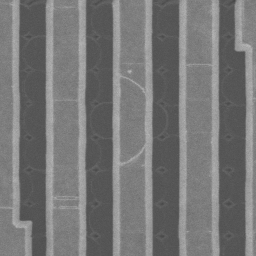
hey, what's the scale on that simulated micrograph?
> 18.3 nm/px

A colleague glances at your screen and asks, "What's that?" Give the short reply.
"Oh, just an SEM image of wiring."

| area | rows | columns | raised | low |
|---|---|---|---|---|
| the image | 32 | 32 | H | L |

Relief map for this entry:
HHLLLLHHHHLLLLLHHHHLLLLHHHHLLLHH
HHLLLLHHHHLLLLLHHHHLLLLHHHHLLLHH
HHLLLLHHHHLLLLLHHHHLLLLHHHHLLLHH
HHLLLLHHHHLLLLLHHHHLLLLHHHHLLLHH
HHLLLLHHHHLLLLLHHHHLLLLHHHHLLLHH
HHLLLLHHHHLLLLLHHHHLLLLHHHHLLLHH
HHLLLLHHHHLLLLLHHHHLLLLHHHHLLLLH
HHLLLLHHHHLLLLLHHHHLLLLHHHHLLLLH
HHLLLLHHHHLLLLLHHHHLLLLHHHHLLLLH
HHLLLLHHHHLLLLLHHHHLLLLHHHHLLLLH
HHLLLLHHHHLLLLLHHHHLLLLHHHHLLLLH
HHLLLLHHHHLLLLLHHHHLLLLHHHHLLLLH
HHLLLLHHHHLLLLLHHHHLLLLHHHHLLLLH
HHLLLLHHHHLLLLLHHHHLLLLHHHHLLLLH
HHLLLLHHHHLLLLLHHHHLLLLHHHHLLLLH
HHLLLLHHHHLLLLLHHHHLLLLHHHHLLLLH
HHLLLLHHHHLLLLLHHHHLLLLHHHHLLLLH
HHLLLLHHHHLLLLLHHHHLLLLHHHHLLLLH
HHLLLLHHHHLLLLLHHHHLLLLHHHHLLLLH
HHLLLLHHHHLLLLLHHHHLLLLHHHHLLLLH
HHLLLLHHHHLLLLLHHHHLLLLHHHHLLLLH
HHLLLLHHHHLLLLLHHHHLLLLHHHHLLLLH
HHLLLLHHHHLLLLLHHHHLLLLHHHHLLLLH
HHLLLLHHHHLLLLLHHHHLLLLHHHHLLLLH
HHLLLLHHHHLLLLLHHHHLLLLHHHHLLLLH
HHLLLLHHHHLLLLLHHHHLLLLHHHHLLLLH
HHLLLLHHHHLLLLLHHHHLLLLHHHHLLLLH
HHLLLLHHHHLLLLLHHHHLLLLHHHHLLLLH
HHHHLLHHHHLLLLLHHHHLLLLHHHHLLLLH
HHHHLLHHHHLLLLLHHHHLLLLHHHHLLLLH
HHHHLLHHHHLLLLLHHHHLLLLHHHHLLLLH
HHHHLLHHHHLLLLLHHHHLLLLHHHHLLLLH